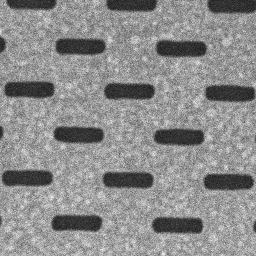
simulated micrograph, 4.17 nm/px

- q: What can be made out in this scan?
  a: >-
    a regular array of holes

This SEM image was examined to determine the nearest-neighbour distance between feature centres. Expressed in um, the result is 0.278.